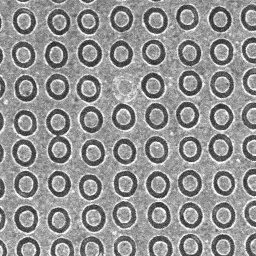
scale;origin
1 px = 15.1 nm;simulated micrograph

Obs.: a regular array of ring-shaped grooves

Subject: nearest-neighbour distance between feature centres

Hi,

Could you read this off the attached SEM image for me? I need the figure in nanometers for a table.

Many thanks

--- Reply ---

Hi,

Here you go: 474